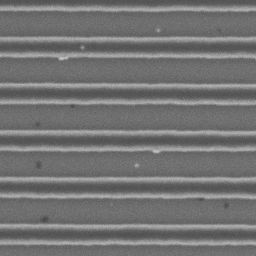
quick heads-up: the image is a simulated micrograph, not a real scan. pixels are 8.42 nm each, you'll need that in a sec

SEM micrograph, lines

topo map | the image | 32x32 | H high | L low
HHHHHHHHHHHHHHHHHHHHHHHHHHHHHHHH
LLLLLLLLLLLLLLLLLLLLLLLLLLLLLLLL
LLLLLLLLLLLLLLLLLLLLLLLLLLLLLLLL
LLLLLLLLLLLLLLLLLLLLLLLLLLLLLLLL
LLLLLLLLLLLLLLLLLLLLLLLLLLLLLLLL
HHHHHHHHHHHHHHHHHHHHHHHHHHHHHHHH
HHHHHHHHHHHHHHHHHHHHHHHHHHHHHHHH
LLLLLLLLLLLLLLLLLLLLLLLLLLLLLLLL
LLLLLLLLLLLLLLLLLLLLLLLLLLLLLLLL
LLLLLLLLLLLLLLLLLLLLLLLLLLLLLLLL
LLLLLLLLLLLLLLLLLLLLLLLLLLLLLLLL
HHHHHHHHHHHHHHHHHHHHHHHHHHHHHHHH
HHHHHHHHHHHHHHHHHHHHHHHHHHHHHHHH
LLLLLLLLLLLLLLLLLLLLLLLLLLLLLLLL
LLLLLLLLLLLLLLLLLLLLLLLLLLLLLLLL
LLLLLLLLLLLLLLLLLLLLLLLLLLLLLLLL
LLLLLLLLLLLLLLLLLLLLLLLLLLLLLLLL
HHHHHHHHHHHHHHHHHHHHHHHHHHHHHHHH
HHHHHHHHHHHHHHHHHHHHHHHHHHHHHHHH
LLLLLLLLLLLLLLLLLLLLLLLLLLLLLLLL
LLLLLLLLLLLLLLLLLLLLLLLLLLLLLLLL
LLLLLLLLLLLLLLLLLLLLLLLLLLLLLLLL
HHHHHHHHHHHHHHHHHHHHHHHHHHHHHHHH
HHHHHHHHHHHHHHHHHHHHHHHHHHHHHHHH
LLLLHHHHHHHHHHHHHHHHHHHHLHHHHHHH
LLLLLLLLLLLLLLLLLLLLLLLLLLLLLLLL
LLLLLLLLLLLLLLLLLLLLLLLLLLLLLLLL
LLLLLLLLLLLLLLLLLLLLLLLLLLLLLLLL
HHHHHHHHHHHHHHHHHHHHHHHHHHHHHHHH
HHHHHHHHHHHHHHHHHHHHHHHHHHHHHHHH
LLLLLLLLLLLLLLLLLLLLLLLLLLLLLLLL
LLLLLLLLLLLLLLLLLLLLLLLLLLLLLLLL